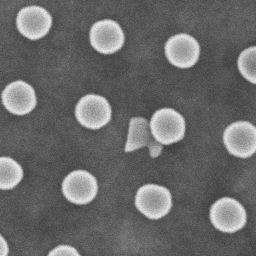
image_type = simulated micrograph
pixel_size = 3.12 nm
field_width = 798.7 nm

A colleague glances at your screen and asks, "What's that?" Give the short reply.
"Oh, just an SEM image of a regular array of raised bodies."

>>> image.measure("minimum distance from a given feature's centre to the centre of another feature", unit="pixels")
75.3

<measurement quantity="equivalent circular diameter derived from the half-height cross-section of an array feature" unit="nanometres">104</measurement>